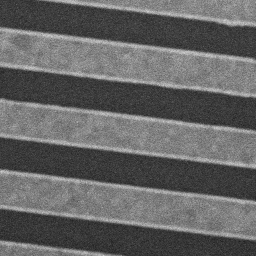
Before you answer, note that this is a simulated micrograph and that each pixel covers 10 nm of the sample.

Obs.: one or a few lines or trenches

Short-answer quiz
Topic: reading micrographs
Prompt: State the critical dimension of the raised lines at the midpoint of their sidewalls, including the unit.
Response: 359 nm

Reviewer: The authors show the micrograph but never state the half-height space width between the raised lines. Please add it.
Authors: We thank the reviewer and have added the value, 350 nm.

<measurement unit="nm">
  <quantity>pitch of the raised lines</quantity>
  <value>706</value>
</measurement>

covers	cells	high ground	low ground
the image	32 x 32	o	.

...........ooooooooooooooooooooo
...................ooooooooooooo
...........................ooooo
................................
ooooooo.........................
ooooooooooooooo.................
oooooooooooooooooooooooo........
ooooooooooooooooooooooooooooooo.
...ooooooooooooooooooooooooooooo
...........ooooooooooooooooooooo
...................ooooooooooooo
............................oooo
................................
oooooooo........................
oooooooooooooooo................
oooooooooooooooooooooooo........
oooooooooooooooooooooooooooooooo
.....ooooooooooooooooooooooooooo
.............ooooooooooooooooooo
.....................ooooooooooo
.............................ooo
o...............................
ooooooooo.......................
oooooooooooooooooo..............
oooooooooooooooooooooooooo......
oooooooooooooooooooooooooooooooo
.....ooooooooooooooooooooooooooo
.............ooooooooooooooooooo
.....................ooooooooooo
..............................oo
oo..............................
oooooooooo......................